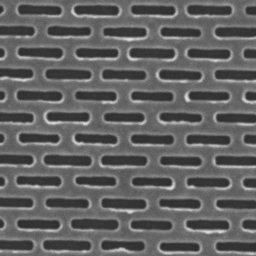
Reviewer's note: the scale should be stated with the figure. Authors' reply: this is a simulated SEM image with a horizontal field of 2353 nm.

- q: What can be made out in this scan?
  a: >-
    a regular array of holes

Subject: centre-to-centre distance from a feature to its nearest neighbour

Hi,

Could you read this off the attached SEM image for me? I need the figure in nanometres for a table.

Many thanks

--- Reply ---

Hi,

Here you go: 321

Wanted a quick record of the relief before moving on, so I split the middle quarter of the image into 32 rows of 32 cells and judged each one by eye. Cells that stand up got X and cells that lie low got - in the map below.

XXXXXXXXXXXXXXXXXXXXXXXXXXXXXXXX
------XXXX---X--XXXXXXXX-----XXX
-------XX------------XXX--------
-------XXX-----------XXX--------
XXXXXXXXXXXXXXXXXXXXXXXXXXXXXXXX
XXXXXXXXXXXXXXXXXXXXXXXXXXXXXXXX
XXXXXXXXXXXXXXXXXXXXXXXXXXXXXXXX
XXX----------XXXX----------XXXX-
XXX----------XXXX-----------XXX-
XXXXXXXXXXXXXXXXXXXXXXXXXXXXXXXX
XXXXXXXXXXXXXXXXXXXXXXXXXXXXXXXX
XXXXXXXXXXXXXXXXXXXXXXXXXXXXXXXX
------XXXX----------XXXX--------
------XXXX----------XXXX--------
------XXXXX--------XXXXXX--XXXX-
XXXXXXXXXXXXXXXXXXXXXXXXXXXXXXXX
XXXXXXXXXXXXXXXXXXXXXXXXXXXXXXXX
XXX----XXXXXXXXXXX--XXXXXXXXXXXX
XXX----------XXXX----------XXXX-
XXX----------XXXX----------XXXX-
XXXXXXXXXXXXXXXXXXXXXXXXXXXXXXXX
XXXXXXXXXXXXXXXXXXXXXXXXXXXXXXXX
XXXXXXXXXXXXXXXXXXXXXXXXXXXXXXXX
-------XX------------XXX--------
-------XX------------XXX--------
XX----XXXXXXXXXXXX--XXXXXXXX----
XXXXXXXXXXXXXXXXXXXXXXXXXXXXXXXX
XXXXXXXXXXXXXXXXXXXXXXXXXXXXXXXX
XXX----------XXXXX--------XXXXX-
XXX----------XXXX----------XXXX-
XXXXXXXX----XXXXXX---------XXXX-
XXXXXXXXXXXXXXXXXXXXXXXXXXXXXXXX